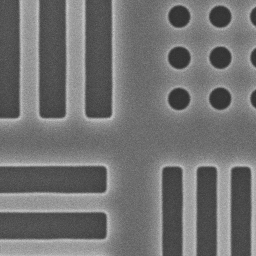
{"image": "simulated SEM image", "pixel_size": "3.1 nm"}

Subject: groups of lines, slits or small figures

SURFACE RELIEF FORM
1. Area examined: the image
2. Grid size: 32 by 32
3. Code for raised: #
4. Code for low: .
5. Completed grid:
...##...##....##################
...##...##....#######...##...##.
...##...##....#######...##...##.
...##...##....##################
...##...##....##################
...##...##....##################
...##...##....#######...##...###
...##...##....#######...##...##.
...##...##....########.####.####
...##...###...##################
...##...###...##################
...##...##....#######..###...###
...##...##....#######...##...##.
...##...##....########.####.####
..###...###...##################
################################
################################
################################
################################
################################
################################
.............#######...##..##..#
..............######...#...##...
.............#######...#...##...
####################...#...##...
####################...#...##...
.............#######...#...##...
.............#######...#...##...
..............######...#...##..#
.............#######...#...##...
####################...#...##...
####################...#...##...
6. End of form